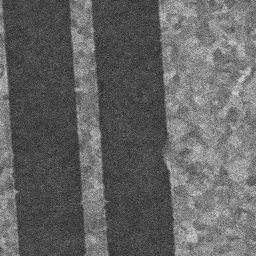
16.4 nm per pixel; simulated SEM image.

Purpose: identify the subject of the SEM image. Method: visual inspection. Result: one or a few lines or trenches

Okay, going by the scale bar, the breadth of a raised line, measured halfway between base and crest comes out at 319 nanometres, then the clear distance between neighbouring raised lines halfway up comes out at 1.14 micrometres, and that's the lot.